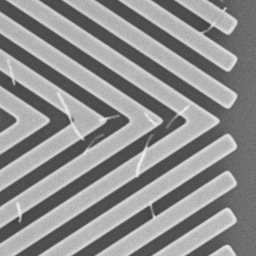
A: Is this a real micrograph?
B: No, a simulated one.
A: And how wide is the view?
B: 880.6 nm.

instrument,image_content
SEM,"groups of lines, slits or small figures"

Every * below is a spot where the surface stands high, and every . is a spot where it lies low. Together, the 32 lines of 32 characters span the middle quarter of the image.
*****......********......*******
******......********......******
********......********......****
.********......********......***
...********......********......*
....********......********......
.....*********......********....
*......********......********...
***......********......********.
****......********......********
******......********......******
*******......********......*****
*********......********.....****
..*********.....********......**
..*********.....*********.....**
.********......********......***
********......********......****
******......********......******
*****......********......*******
***......********......********.
*.......********......********..
.....*********......********....
....*********.....*********.....
...********......********......*
.********......*********......**
********......********......****
******......*********......*****
*****......********......*******
***......*********......********
**......********......********..
......*********.....*********...
.....********......********.....